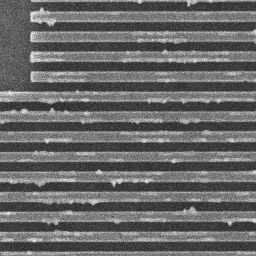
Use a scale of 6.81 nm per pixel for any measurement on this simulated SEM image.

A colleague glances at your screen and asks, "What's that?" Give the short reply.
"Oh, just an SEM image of parallel lines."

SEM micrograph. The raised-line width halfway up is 63.9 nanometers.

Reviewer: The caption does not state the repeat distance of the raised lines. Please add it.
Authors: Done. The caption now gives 136 nm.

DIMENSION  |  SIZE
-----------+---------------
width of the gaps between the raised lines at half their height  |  69.8 nanometres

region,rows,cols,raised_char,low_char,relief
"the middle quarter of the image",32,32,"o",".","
................................
................................
oooooooooooooooooooooooooooooooo
oooooooooooooooooooooooooooooooo
o........................o......
................................
................................
oooooooooooooooooooooooooooooooo
oooooooooooooooooooooooooooooooo
.....................ooooo...oo.
................................
................................
oooooooooooooooooooooooooooooooo
oooooooooooooooooooooooooooooooo
....oooo.........oo...oo.....ooo
................................
................................
oooooooooooooooooooooooooooooooo
oooooooooooooooooooooooooooooooo
o..................oo..ooo......
................................
................................
oooooooooooooooooooooooooooooooo
oooooooooooooooooooooooooooooooo
...........................o....
................................
................................
oooooooooooooooooooooooooooooooo
oooooooooooooooooooooooooooooooo
..o........oooo..oo.oo..........
................................
................................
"